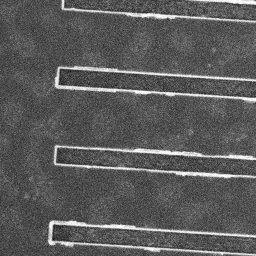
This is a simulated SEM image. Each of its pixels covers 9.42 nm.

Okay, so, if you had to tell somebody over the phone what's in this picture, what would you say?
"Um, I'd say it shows one or a few lines or trenches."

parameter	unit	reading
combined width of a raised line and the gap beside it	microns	0.733